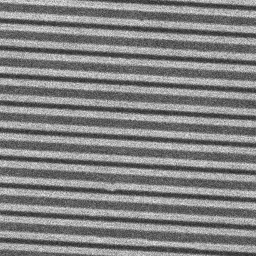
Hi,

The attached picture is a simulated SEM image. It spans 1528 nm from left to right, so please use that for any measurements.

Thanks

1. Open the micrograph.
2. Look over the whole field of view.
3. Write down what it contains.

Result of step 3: parallel lines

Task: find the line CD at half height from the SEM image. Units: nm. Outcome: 37.3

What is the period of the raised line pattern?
0.0819 µm